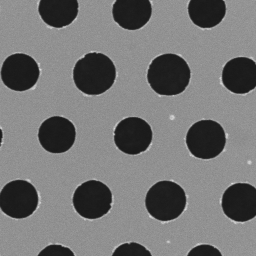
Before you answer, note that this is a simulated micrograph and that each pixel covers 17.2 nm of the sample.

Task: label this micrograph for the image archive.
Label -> a regular array of holes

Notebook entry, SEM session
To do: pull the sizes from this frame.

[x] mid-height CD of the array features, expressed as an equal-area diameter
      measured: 0.679 um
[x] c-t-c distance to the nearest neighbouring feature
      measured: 1240 nm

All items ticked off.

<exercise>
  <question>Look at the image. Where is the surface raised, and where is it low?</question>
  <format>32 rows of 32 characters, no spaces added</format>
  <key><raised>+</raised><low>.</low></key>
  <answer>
+++++.....++++.....+++++....++++
+++++.....++++.....+++++....++++
+++++....+++++.....+++++....++++
++++++++++++++++.++++++++.++++++
++++++++++++++++++++++++++++++++
++++++++++++++++++++++++++++++++
++++++++++++++++++++++++++++++++
+...++++++....+++++....++++++..+
.....++++.....+++++.....++++....
.....++++.....++++......++++....
+...+++++.....+++++.....++++....
++++++++++...++++++....++++++..+
++++++++++++++++++++++++++++++++
++++++++++++++++++++++++++++++++
++++++++++++++++++++++++++++++++
+++++....++++++....+++++...+++++
+++++....+++++.....++++.....++++
+++++....+++++.....++++.....++++
+++++....++++++...+++++.....++++
++++++++++++++++++++++++...+++++
++++++++++++++++++++++++++++++++
++++++++++++++++++++++++++++++++
++.+++++++++++++++++++++++++++++
....++++++....+++++....+++++....
.....++++.....++++.....+++++....
.....++++.....++++.....+++++....
....++++++...++++++....+++++....
++++++++++++++++++++.++++++++..+
++++++++++++++++++++++++++++++++
++++++++++++++++++++++++++++++++
+++++++++++++++..+++++++++++++++
+++++....+++++.....+++++...+++++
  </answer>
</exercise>